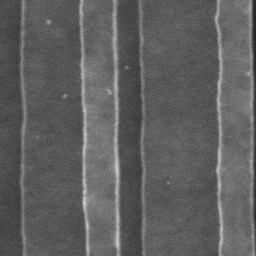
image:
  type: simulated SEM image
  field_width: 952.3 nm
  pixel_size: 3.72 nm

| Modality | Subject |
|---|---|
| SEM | lines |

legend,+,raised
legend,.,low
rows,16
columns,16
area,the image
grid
.....++.......++
.....++.......++
.....++.......++
.....++.......++
.....++.......++
.....++.......++
.....++.......++
.....++.......++
.....++.......++
.....++.......++
.....++.......++
.....++.......++
.....++.......++
.....++.......++
.....++.......++
.....++.......++